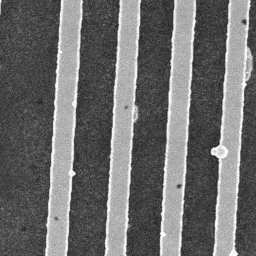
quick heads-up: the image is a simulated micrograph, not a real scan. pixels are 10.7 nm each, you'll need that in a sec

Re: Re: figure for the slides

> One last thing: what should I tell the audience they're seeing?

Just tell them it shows lines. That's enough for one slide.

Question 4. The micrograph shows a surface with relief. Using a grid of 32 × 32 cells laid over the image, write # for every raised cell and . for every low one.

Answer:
........##.....###....##.....##.
........##.....##.....##.....##.
........##.....##.....##.....##.
.......###.....##.....##....###.
.......###.....##.....##....###.
.......###.....##.....##....###.
.......###.....##.....##....###.
.......###.....##....###....###.
.......###.....##....###....###.
.......###....###....###....###.
.......###....###....###....###.
.......###....###....###....##..
.......##.....###....###....##..
.......##.....###....###....##..
.......##.....###....###....##..
.......##.....###....###....##..
.......##.....###....##.....##..
.......##.....###....##.....##..
.......##.....##.....##....###..
......###.....##.....##....###..
......###.....##.....##....###..
......###.....##.....##....###..
......###.....##.....##....###..
......###.....##....###....###..
......###.....##....###....###..
......###....###....###....###..
......###....###....###....###..
......###....###....###....##...
......###....###....###....##...
......###....###....###....##...
......##.....###....###....##...
......##.....###....##.....##...